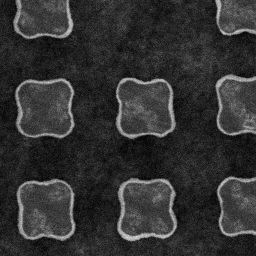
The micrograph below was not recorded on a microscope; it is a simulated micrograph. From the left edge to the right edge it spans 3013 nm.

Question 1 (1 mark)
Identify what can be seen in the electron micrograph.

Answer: raised bodies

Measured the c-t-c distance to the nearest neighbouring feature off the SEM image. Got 1180 nanometers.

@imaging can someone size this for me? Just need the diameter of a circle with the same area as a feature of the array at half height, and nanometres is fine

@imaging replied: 714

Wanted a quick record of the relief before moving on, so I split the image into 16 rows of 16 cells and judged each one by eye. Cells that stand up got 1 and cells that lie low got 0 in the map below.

0111000000000011
0111000000000011
0000000000000000
0000000000000000
0000000000000000
0111000111100011
0111000111100011
0111000111100011
0000000010000000
0000000000000000
0000000000000000
0011000011000011
0111100011100011
0111100011100011
0111000011100011
0000000000000000